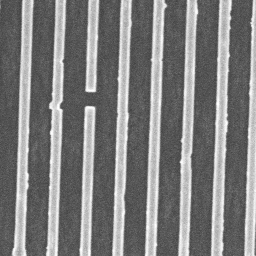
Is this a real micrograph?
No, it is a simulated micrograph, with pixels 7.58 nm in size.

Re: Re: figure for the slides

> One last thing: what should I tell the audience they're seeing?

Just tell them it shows parallel lines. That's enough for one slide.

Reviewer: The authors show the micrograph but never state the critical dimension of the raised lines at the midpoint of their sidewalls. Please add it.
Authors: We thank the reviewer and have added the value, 70.1 nanometres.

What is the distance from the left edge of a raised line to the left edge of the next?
249 nm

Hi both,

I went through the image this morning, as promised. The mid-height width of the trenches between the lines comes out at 0.174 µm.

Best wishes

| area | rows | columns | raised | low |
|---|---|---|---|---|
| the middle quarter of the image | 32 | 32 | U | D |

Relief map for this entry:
DDDDDDUUDDDDDDUUDDDDDDUUDDDDDDUU
DDDDDDUUDDDDDDUUDDDDDDUUDDDDDDUU
DDDDDDUUDDDDDDUUDDDDDDUUDDDDDDUU
DDDDDDUUDDDDDUUUDDDDDDUUDDDDDDUU
DDDDDDUUDDDDDDUUDDDDDDUUDDDDDDUU
DDDDDDUUDDDDDDUUDDDDDDUUDDDDDDUU
DDDDDDUUDDDDDDUUDDDDDDUUDDDDDDUU
DDDDDDDDDDDDDDUUDDDDDDUUDDDDDDUU
DDDDDDDDDDDDDDUUDDDDDDUUDDDDDDUU
DDDDDDDDDDDDDDUUDDDDDDUUDDDDDDUU
DDDDDDDDDDDDDDUUDDDDDDUUDDDDDDUU
DDDDDUUUDDDDDUUUDDDDDDUUDDDDDDUU
DDDDDUUDDDDDDDUUDDDDDDUUDDDDDDUU
DDDDDUUDDDDDDDUUDDDDDDUUDDDDDDUU
DDDDDUUUDDDDDUUUDDDDDDUUDDDDDDUU
DDDDDUUDDDDDDUUUDDDDDDUUDDDDDDUU
DDDDDUUDDDDDDUUUDDDDDDUUDDDDDDUU
DDDDDUUDDDDDDUUUDDDDDDUUDDDDDDUU
DDDDDUUDDDDDDUUUDDDDDUUUDDDDDDUU
DDDDDUUDDDDDDUUUDDDDDUUUDDDDDUUU
DDDDDUUDDDDDDUUDDDDDDDUUDDDDDUUU
DDDDDUUDDDDDDUUDDDDDDUUUDDDDDDUU
DDDDDUUDDDDDDUUDDDDDDUUUDDDDDUUU
DDDDDUUDDDDDDUUDDDDDDUUUDDDDDUUD
DDDDDUUDDDDDDUUDDDDDDUUUDDDDDUUD
DDDDDUUDDDDDDUUDDDDDDUUUDDDDDUUD
DDDDDUUDDDDDDUUDDDDDDUUUDDDDDUUU
DDDDDUUDDDDDDUUDDDDDDUUDDDDDDUUU
DDDDDUUDDDDDDUUDDDDDDUUDDDDDDUUU
DDDDDUUDDDDDDUUDDDDDDUUDDDDDDUUD
DDDDDUUDDDDDDUUDDDDDDUUDDDDDDUUU
DDDDDUUDDDDDDUUDDDDDDUUDDDDDDUUU